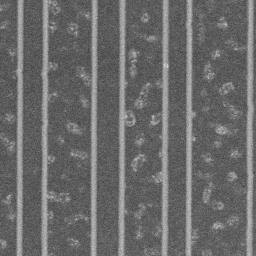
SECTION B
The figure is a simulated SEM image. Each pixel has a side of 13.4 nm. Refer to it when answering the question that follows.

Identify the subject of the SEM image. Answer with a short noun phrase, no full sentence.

one or a few lines or trenches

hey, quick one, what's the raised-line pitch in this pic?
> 1000 nm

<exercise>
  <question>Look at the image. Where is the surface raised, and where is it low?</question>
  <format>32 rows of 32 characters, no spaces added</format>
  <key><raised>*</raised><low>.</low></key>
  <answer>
**....******...******...*******.
***...******...******...*******.
***...******...******...*******.
***...******...******...*******.
**....******...******...*******.
***...******...******...*******.
***...******...******...*******.
***...******...******...*******.
***...******...******...*******.
***...******...******...*******.
**....******...******...*******.
**....******...******...*******.
**....******...******...*******.
**....******...******...*******.
**....******...******...*******.
**....******...******...*******.
**....******...******...*******.
**....******...******...*******.
**....******...******...*******.
**....******...******...*******.
**....******...******...*******.
**....******...******...*******.
**....******...******...*******.
**....******...******...*******.
**....******...******...*******.
**....******...******...*******.
**....******...******...*******.
**....******...******...*******.
**....******...******...*******.
**....******...******...*******.
**....******...*****....*******.
**....******...*****....*******.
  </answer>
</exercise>